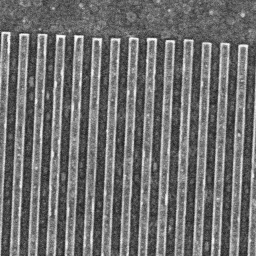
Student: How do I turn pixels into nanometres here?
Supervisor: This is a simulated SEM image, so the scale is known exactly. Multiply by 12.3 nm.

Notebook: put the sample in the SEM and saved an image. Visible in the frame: parallel lines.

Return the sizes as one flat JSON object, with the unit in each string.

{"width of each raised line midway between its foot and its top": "0.0998 µm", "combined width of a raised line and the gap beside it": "225 nanometres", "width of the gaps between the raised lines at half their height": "121 nm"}